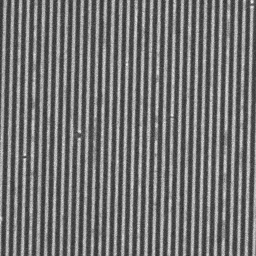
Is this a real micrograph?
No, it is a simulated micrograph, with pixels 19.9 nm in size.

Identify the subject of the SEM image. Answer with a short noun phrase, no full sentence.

parallel lines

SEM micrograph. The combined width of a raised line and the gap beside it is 154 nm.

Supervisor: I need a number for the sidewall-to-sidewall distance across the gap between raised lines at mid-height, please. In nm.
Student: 110